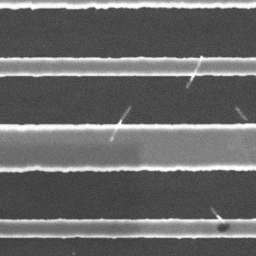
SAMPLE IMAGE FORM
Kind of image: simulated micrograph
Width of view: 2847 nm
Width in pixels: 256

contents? lines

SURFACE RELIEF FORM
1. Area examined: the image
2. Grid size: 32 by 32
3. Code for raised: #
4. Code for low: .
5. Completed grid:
################################
................................
................................
................................
................................
................................
................................
################################
################################
#...#..................##.......
................................
................................
................................
................................
................................
................................
################################
################################
################################
################################
################################
................................
................................
................................
................................
................................
................................
.......#....#........#.....#...#
################################
################################
................................
................................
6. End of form